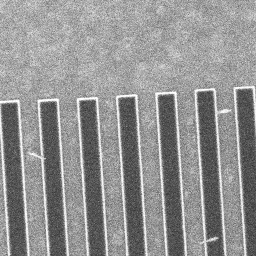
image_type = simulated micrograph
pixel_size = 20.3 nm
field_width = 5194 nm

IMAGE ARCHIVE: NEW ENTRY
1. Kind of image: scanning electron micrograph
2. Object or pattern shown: parallel lines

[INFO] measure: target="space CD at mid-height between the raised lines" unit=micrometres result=0.392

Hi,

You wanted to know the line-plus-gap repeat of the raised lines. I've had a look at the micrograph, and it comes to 0.794 µm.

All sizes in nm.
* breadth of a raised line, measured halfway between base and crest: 395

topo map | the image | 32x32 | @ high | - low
--------------------------------
--------------------------------
--------------------------------
--------------------------------
--------------------------------
--------------------------------
--------------------------------
--------------------------------
--------------------------------
--------------------------------
--------------------------------
-------------------------@@--@@@
------@---@@---@@---@@--@@@--@@@
@@---@@---@@---@@---@@---@@--@@@
@@---@@---@@---@@---@@---@@---@@
@@@--@@---@@---@@---@@---@@---@@
@@@--@@---@@---@@---@@---@@---@@
@@@--@@@--@@---@@---@@---@@---@@
@@@--@@@--@@@--@@---@@---@@---@@
@@@--@@@--@@@--@@---@@---@@---@@
@@@--@@@--@@@--@@@--@@---@@---@@
@@@--@@@--@@@--@@@--@@@--@@@--@@
-@@--@@@--@@@--@@@--@@@--@@@--@@
-@@---@@---@@--@@@--@@@--@@@--@@
-@@---@@--@@@--@@@--@@@--@@@--@@
-@@---@@---@@--@@@--@@@--@@@--@@
-@@---@@---@@---@@---@@--@@@--@@
-@@---@@---@@---@@---@@--@@@--@@
-@@---@@---@@---@@---@@--@@@--@@
-@@---@@---@@---@@---@@---@@---@
-@@@--@@---@@---@@---@@--@@@---@
-@@@--@@---@@---@@---@@---@@---@